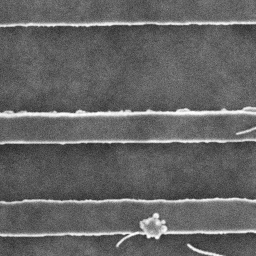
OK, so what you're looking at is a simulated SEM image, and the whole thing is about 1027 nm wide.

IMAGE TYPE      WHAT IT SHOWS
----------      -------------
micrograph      lines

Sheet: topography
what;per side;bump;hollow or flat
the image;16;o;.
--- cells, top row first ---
oooooooooooooooo
ooooooooooooooo.
................
................
................
................
................
oooooooooooooooo
oooooooooooooooo
................
................
................
.......oo...oooo
oooooooooooooooo
oooooooooooooooo
................